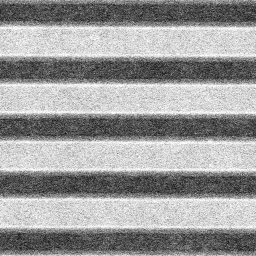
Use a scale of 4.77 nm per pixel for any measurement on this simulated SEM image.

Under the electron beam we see parallel lines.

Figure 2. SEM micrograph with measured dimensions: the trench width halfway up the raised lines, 25 px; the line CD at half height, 153 nm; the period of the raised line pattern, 273 nm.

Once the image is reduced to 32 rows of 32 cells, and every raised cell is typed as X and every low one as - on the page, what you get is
--------------------------------
--------------------------------
--------------------------------
XXXXXXXXXXXXXXXXXXXXXXXXXXXXXXXX
XXXXXXXXXXXXXXXXXXXXXXXXXXXXXXXX
XXXXXXXXXXXXXXXXXXXXXXXXXXXXXXXX
XXXXXXXXXXXXXXXXXXXXXXXXXXXXXXXX
--------------------------------
--------------------------------
--------------------------------
XXXXXXXXXXXXXXXXXXXXXXXXXXXXXXXX
XXXXXXXXXXXXXXXXXXXXXXXXXXXXXXXX
XXXXXXXXXXXXXXXXXXXXXXXXXXXXXXXX
XXXXXXXXXXXXXXXXXXXXXXXXXXXXXXXX
--------------------------------
--------------------------------
--------------------------------
--------------------------X-----
XXXXXXXXXXXXXXXXXXXXXXXXXXXXXXXX
XXXXXXXXXXXXXXXXXXXXXXXXXXXXXXXX
XXXXXXXXXXXXXXXXXXXXXXXXXXXXXXXX
--------------------------------
--------------------------------
--------------------------------
--------------------------------
XXXXXXXXXXXXXXXXXXXXXXXXXXXXXXXX
XXXXXXXXXXXXXXXXXXXXXXXXXXXXXXXX
XXXXXXXXXXXXXXXXXXXXXXXXXXXXXXXX
XXXXXXXXXXXXXXXXXXXXXXXXXXXXXXXX
--------------------------------
--------------------------------
--------------------------------